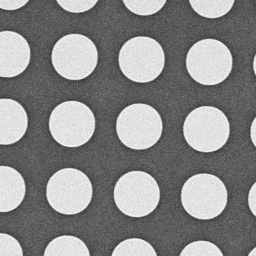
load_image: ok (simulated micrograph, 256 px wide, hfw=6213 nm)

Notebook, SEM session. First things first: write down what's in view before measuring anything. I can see an array of small figures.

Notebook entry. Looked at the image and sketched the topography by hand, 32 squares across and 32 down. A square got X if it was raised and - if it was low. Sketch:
XXX----XXXXX----XXXX----XXXXX---
---------X-------XXX-----XXX----
--------------------------------
--------------------------------
XXX-----XX----------------------
XXX----XXXXX----XXXX----XXXX----
XXXX---XXXXX---XXXXX----XXXXX---
XXXX---XXXXX---XXXXXX--XXXXXX---
XXX----XXXXX---XXXXX---XXXXXX---
XX------XXX-----XXXX----XXXX----
-------------------------XX-----
--------------------------------
X-------------------------------
XXX----XXXX-----XXX------XX-----
XXX---XXXXXX---XXXXX----XXXX----
XXX---XXXXXX---XXXXX---XXXXXX---
XXX---XXXXXX---XXXXX---XXXXXX--X
XX-----XXXX----XXXXX---XXXXX----
----------------XX------XXX-----
--------------------------------
--------------------------------
XX-----XXX------XX--------------
XXX---XXXXX----XXXX-----XXX-----
XXX---XXXXX---XXXXXX---XXXXX---X
XXX---XXXXX---XXXXXX---XXXXX---X
XX----XXXXX----XXXXX---XXXXX---X
-------XXX-----XXXX----XXXXX----
--------------------------------
--------------------------------
X-------------------------------
XX----XXXXX----XXXX-----XXX-----
XXX---XXXXX---XXXXX----XXXXX---X